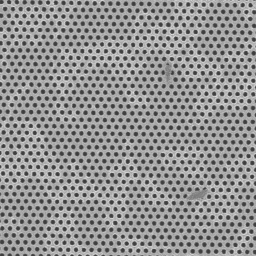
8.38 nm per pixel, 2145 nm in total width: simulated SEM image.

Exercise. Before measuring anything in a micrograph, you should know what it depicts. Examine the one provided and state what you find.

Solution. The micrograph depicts a regular array of holes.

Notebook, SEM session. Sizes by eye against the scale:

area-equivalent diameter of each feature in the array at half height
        0.0354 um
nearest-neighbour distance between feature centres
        64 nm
